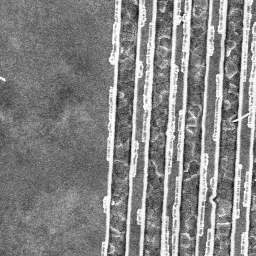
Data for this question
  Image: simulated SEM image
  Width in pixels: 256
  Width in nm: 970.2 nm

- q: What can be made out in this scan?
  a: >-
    parallel lines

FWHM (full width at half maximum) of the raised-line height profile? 0.0563 micrometres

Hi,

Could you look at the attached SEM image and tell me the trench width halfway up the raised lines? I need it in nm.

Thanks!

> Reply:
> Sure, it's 76.6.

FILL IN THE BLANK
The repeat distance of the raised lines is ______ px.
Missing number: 35